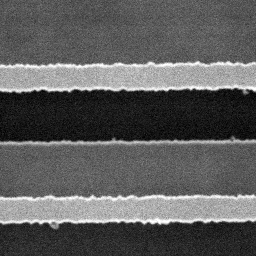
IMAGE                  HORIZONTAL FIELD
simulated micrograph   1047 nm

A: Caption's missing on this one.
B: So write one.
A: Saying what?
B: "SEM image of lines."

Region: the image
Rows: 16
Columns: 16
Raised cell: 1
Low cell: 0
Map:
1111111111111111
1111111111111111
1111111111111111
1111111111111111
1111111111111111
1111111111111101
0000000000000000
0000000000000000
0000000000000000
1111111111111111
1111111111111111
1111111111111111
1111111111111111
1111111111111111
0000000000000000
0000000000000000